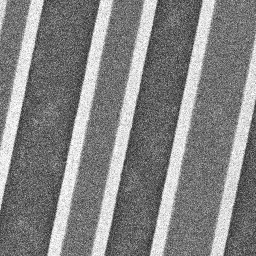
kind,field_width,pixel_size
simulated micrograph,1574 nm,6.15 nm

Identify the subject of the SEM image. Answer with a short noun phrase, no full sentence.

one or a few lines or trenches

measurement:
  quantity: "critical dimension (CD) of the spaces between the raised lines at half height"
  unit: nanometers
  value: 358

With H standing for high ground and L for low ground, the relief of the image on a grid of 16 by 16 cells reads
HHLLLLLHHLLLLHHH
HHLLLLHHHLLLLHHH
HHLLLLHHHLLLLHHH
HHLLLLHHHLLLHHHH
HLLLLLHHHLLLHHHH
HLLLLLHHLLLLHHHH
HLLLLHHHLLLLHHHL
HLLLLHHHLLLLHHHL
HLLLLHHHLLLHHHHL
LLLLLHHLLLLHHHHL
LLLLLHHLLLLHHHHL
LLLLHHHLLLLHHHLL
LLLLHHHLLLHHHHLL
LLLLHHHLLLHHHHLL
LLLLHHLLLLHHHHLL
LLLHHHLLLLHHHHLL